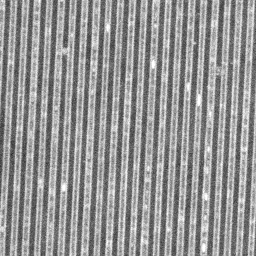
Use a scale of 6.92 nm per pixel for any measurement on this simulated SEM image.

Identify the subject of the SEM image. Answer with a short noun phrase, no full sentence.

parallel lines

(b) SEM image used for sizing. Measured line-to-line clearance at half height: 6.24 pixels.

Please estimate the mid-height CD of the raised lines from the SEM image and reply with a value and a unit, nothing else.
37.1 nm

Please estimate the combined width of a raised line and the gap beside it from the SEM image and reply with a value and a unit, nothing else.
82 nanometres